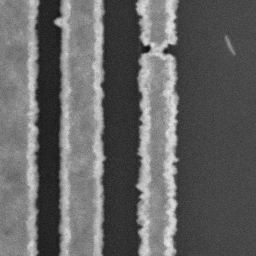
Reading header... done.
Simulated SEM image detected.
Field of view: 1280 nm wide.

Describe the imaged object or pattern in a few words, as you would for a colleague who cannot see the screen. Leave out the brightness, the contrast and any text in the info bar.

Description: one or a few lines or trenches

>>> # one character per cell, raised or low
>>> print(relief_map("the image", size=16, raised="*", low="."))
**..**...**.....
**..**...**.....
**..**...**.....
**..**...*......
**..**...**.....
**..**...**.....
**..**...**.....
**..**...**.....
**..**...**.....
**..**...**.....
**..**...**.....
**..**...**.....
**..**...**.....
**..**...**.....
**..**...**.....
**..**...**.....